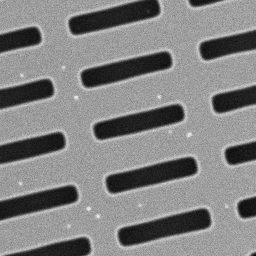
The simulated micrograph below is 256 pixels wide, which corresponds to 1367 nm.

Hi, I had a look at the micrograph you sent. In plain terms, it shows groups of lines, slits or small figures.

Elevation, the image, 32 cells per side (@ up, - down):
@@@@@@@@@@@@@@@@----@@@@--@@@@@@
@@@@@@@@@@@@--------@@@@@@@@@@@@
@@@@@@@@@---------@@@@@@@@@@@@@@
@@@-@@@@@-----@@@@@@@@@@@@@@@@@@
-----@@@@@@@@@@@@@@@@@@@@@@@@---
-----@@@@@@@@@@@@@@@@@@@@-------
@@@@@@@@@@@@@@@@@@@@-@@@@-----@@
@@@@@@@@@@@@@@@@-----@@@@@@@@@@@
@@@@@@@@@@@@---------@@@@@@@@@@@
@@@@@@@@@@-------@@@@@@@@@@@@@@@
@@@----@@@---@@@@@@@@@@@@@@@@@@@
-------@@@@@@@@@@@@@@@@@@@@@@---
-----@@@@@@@@@@@@@@@@@@@@@@-----
-@@@@@@@@@@@@@@@@@@@---@@@@---@@
@@@@@@@@@@@@@@@@-------@@@@@@@@@
@@@@@@@@@@@@---------@@@@@@@@@@@
@@@@@@@@@@@@-----@@@@@@@@@@@@@@@
@@@-----@@@@@@@@@@@@@@@@@@@@@@@@
--------@@@@@@@@@@@@@@@@@@@@@---
-----@@@@@@@@@@@@@@@@@@@@@@@----
@@@@@@@@@@@@@@@@@@@@-----@@@@-@@
@@@@@@@@@@@@@@@---------@@@@@@@@
@@@@@@@@@@@@@--------@@@@@@@@@@@
@@@@@@@--@@@@----@@@@@@@@@@@@@@@
@@@-------@@@@@@@@@@@@@@@@@@@@@@
--------@@@@@@@@@@@@@@@@@@@@@@--
----@@@@@@@@@@@@@@@@@@@---@@@@--
@@@@@@@@@@@@@@@@@@@@------@@@@@@
@@@@@@@@@@@@@@@-----------@@@@@@
@@@@@@@@@@@@@@@------@@@@@@@@@@@
@@@@@@@----@@@@--@@@@@@@@@@@@@@@
@@---------@@@@@@@@@@@@@@@@@@@@@